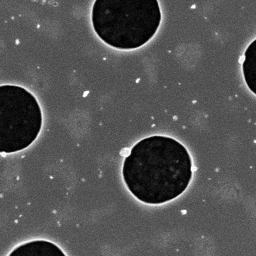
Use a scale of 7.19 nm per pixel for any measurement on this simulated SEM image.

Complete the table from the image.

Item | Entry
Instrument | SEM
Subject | holes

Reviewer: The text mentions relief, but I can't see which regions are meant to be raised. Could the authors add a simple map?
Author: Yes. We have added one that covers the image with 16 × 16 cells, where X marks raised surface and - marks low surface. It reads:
XXXXXX----XXXXXX
XXXXXX----XXXXXX
XXXXXX---XXXXXXX
XXXXXXXXXXXXXXX-
XXXXXXXXXXXXXXX-
-XXXXXXXXXXXXXXX
--XXXXXXXXXXXXXX
---XXXXXXXXXXXXX
--XXXXXXXXXXXXXX
-XXXXXXX----XXXX
XXXXXXXX----XXXX
XXXXXXXX----XXXX
XXXXXXXXX--XXXXX
XXXXXXXXXXXXXXXX
XXXXXXXXXXXXXXXX
X---XXXXXXXXXXXX